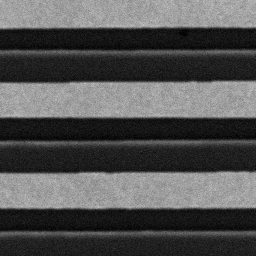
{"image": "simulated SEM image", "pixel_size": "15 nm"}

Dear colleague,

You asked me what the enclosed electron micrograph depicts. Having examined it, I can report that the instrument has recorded lines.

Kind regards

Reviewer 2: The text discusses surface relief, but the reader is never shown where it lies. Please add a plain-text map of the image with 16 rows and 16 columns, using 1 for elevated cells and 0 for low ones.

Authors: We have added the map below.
1111111111111111
1111111111111111
0000000000000000
0000000000000000
0000000000000000
1111111111111111
1111111111111111
0000000000000000
0000000000000000
0000000000000000
0000000000000000
1111111111111111
1111111111111111
0000000000000000
0000000000000000
0000000000000000